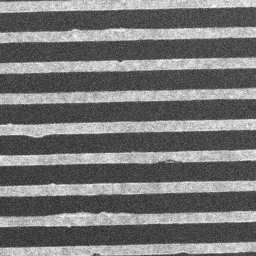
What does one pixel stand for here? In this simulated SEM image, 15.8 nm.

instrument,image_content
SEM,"parallel lines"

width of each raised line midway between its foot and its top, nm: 156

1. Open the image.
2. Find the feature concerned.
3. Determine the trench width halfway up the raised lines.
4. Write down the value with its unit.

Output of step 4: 331 nanometres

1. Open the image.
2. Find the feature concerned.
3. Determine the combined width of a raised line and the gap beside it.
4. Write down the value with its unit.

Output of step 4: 484 nm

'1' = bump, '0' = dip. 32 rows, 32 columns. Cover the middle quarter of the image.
11111111111111111111111111111111
11111111111111111000000000000000
00000000000000000000000000000000
00000000000000000000000000000000
00000000000000000000000000000000
00000000000000000000000000000000
00000000000000000000000000000000
11111111111111111111111111111111
11111111111111111111111111111111
11110000000000000000000000000000
00000000000000000000000000000000
00000000000000000000000000000000
00000000000000000000000000000000
00000000000000000000000000000000
00000000000000000000000011111111
11111111111111111111111111111111
11111111111111111111111111111111
00000000000000000000000000000000
00000000000000000000000000000000
00000000000000000000000000000000
00000000000000000000000000000000
00000000000000000000000000000000
00000000111111111111111111111111
11111111111111111111111111111111
11111111111111111111111000000000
00000000000000000000000000000000
00000000000000000000000000000000
00000000000000000000000000000000
00000000000000000000000000000000
00000000000000000000000000000000
11111111111111111111111111111111
11111111111111111111111111111111